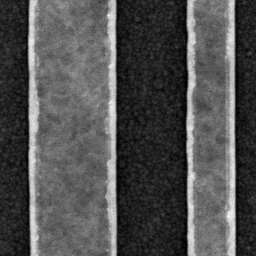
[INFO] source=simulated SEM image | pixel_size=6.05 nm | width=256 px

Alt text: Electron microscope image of one or a few lines or trenches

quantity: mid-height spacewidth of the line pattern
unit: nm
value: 460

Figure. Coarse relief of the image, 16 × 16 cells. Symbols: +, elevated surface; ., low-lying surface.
..+++++.....++..
..+++++.....++..
..+++++.....++..
..+++++.....++..
..+++++.....++..
..+++++.....++..
..+++++.....++..
..+++++.....++..
..+++++.....++..
..+++++.....++..
..+++++.....+++.
..+++++.....++..
..+++++.....++..
..+++++.....+++.
..+++++.....+++.
..+++++.....+++.